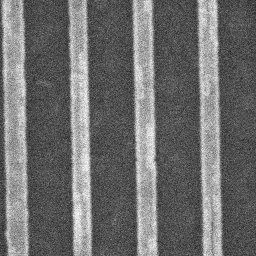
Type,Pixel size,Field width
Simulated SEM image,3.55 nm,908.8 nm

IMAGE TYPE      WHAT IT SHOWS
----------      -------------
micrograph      one or a few lines or trenches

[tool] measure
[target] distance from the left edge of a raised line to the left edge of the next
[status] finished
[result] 231 nanometers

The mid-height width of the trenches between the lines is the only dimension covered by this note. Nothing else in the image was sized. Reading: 174 nanometers